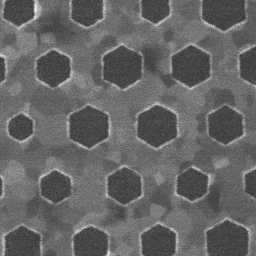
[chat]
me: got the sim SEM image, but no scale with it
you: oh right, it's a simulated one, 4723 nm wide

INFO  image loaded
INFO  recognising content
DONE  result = a regular array of holes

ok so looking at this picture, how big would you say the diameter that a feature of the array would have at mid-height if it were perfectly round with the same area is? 652 nm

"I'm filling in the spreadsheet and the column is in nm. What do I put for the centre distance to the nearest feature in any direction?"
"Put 1260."